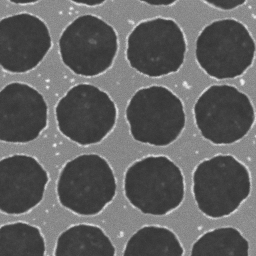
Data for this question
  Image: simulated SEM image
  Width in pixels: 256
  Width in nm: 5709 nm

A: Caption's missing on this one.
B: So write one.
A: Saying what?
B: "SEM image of a regular array of holes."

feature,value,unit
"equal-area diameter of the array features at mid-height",1320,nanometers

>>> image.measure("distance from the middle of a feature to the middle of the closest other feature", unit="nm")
1520